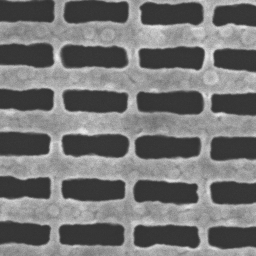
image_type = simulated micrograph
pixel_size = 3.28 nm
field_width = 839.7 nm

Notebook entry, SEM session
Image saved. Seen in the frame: a regular array of holes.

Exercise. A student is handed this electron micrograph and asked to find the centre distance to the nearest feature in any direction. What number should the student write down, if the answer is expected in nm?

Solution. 145